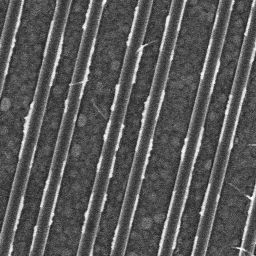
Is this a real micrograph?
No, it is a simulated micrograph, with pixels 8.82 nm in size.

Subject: parallel lines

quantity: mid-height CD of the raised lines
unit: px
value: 14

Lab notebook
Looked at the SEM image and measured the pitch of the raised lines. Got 342 nm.